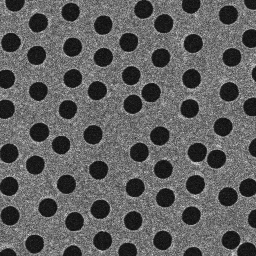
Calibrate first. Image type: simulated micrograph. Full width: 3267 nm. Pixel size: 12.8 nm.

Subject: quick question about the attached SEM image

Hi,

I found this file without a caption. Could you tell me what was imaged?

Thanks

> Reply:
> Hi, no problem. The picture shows a regular array of holes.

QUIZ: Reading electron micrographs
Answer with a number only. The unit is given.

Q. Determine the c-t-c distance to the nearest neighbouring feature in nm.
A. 396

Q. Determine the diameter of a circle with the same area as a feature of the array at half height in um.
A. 0.247